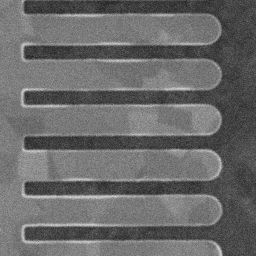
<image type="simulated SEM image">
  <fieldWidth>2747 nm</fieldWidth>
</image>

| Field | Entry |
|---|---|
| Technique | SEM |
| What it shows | groups of lines, slits or small figures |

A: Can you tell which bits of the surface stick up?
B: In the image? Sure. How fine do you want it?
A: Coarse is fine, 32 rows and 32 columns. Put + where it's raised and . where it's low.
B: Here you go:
+++.............................
+++.............................
+++++++++++++++++++++++++++.....
++++++++++++++++++++++++++++....
+++++++++++++++++++++++++++.....
+++++++++++++...++++++..........
+++.............................
+++.............................
+++++++++++++++++++++++++++.....
++++++++++++++++++++++++++++....
+++++++++++++++++++++++++++.....
+++.............................
+++.............................
+++++++++++++++++++++++++++.....
++++++++++++++++++++++++++++....
++++++++++++++++++++++++++++....
+++++++++++++++++++++++++++.....
+++.............................
+++.............................
+++++++++++++++++++++++++++.....
++++++++++++++++++++++++++++....
+++++++++++++++++++++++++++.....
+++++++++..+++++++++++++++......
+++.............................
++++..........++..++++++++......
+++++++++++++++++++++++++++.....
++++++++++++++++++++++++++++....
+++++++++++++++++++++++++++.....
+++.............................
+++.............................
+++++++++++++++++++++++++++.....
++++++++++++++++++++++++++++....